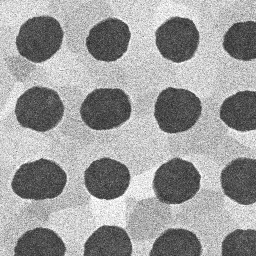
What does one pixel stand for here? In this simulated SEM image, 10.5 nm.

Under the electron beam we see a regular array of holes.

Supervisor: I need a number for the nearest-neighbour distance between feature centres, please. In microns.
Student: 0.721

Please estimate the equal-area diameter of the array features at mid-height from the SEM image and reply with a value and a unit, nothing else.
487 nm